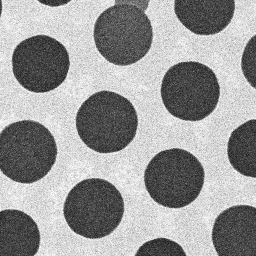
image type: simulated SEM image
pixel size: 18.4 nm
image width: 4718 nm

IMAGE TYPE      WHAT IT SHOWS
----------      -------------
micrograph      holes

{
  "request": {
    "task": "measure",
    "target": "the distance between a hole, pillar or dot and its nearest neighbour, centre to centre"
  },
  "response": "1.61 um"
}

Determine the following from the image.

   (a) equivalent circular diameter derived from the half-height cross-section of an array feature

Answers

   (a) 1110 nm